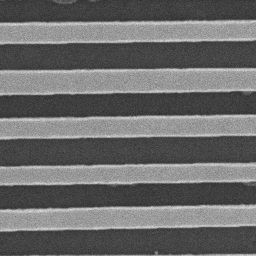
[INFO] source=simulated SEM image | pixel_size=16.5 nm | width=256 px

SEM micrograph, lines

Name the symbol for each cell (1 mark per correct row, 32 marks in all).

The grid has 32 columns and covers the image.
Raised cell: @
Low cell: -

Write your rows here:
--------------------------------
--------------------------------
--------------------------------
@@@@@@@@@@@@@@@@@@@@@@@@@@@@@@@@
@@@@@@@@@@@@@@@@@@@@@@@@@@@@@@@@
@-------------------------------
--------------------------------
--------------------------------
--------------------------------
@@@@@@@@@@@@@@@@@@@@@@@@@@@@@@@@
@@@@@@@@@@@@@@@@@@@@@@@@@@@@@@@@
@@@@@@@@@@@@@@@@@@@@@@@@--------
--------------------------------
--------------------------------
------------------------@-@@@@@@
@@@@@@@@@@@@@@@@@@@@@@@@@@@@@@@@
@@@@@@@@@@@@@@@@@@@@@@@@@@@@@@@@
--------------------------------
--------------------------------
--------------------------------
------------------------@@@@@@@@
@@@@@@@@@@@@@@@@@@@@@@@@@@@@@@@@
@@@@@@@@@@@@@@@@@@@@@@@@@@@@@@@@
--------------------------------
--------------------------------
--------------------------------
@@@@@@@@@@@@@@@@@@@@@@@@@@@@@@@@
@@@@@@@@@@@@@@@@@@@@@@@@@@@@@@@@
@@@@@@@@@@@@@@@@@@@@------------
--------------------------------
--------------------------------
--------------------------------